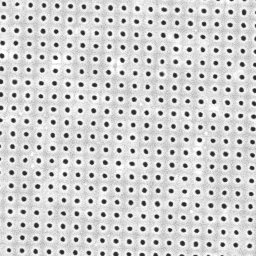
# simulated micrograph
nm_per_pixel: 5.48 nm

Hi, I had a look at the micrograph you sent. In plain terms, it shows a regular array of holes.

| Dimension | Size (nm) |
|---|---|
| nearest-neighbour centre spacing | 70.1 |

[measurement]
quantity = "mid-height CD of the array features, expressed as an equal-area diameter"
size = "26.9 nm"